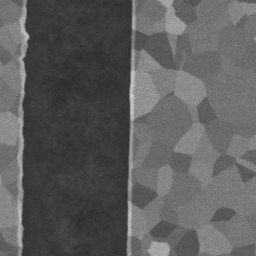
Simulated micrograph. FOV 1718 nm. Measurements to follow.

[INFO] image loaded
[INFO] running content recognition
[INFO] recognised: one or a few lines or trenches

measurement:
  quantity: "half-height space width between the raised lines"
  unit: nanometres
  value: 734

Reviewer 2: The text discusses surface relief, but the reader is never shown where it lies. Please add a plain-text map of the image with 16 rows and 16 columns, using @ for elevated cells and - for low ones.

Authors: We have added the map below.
@@------@@@@@@@@
@-------@@@@@@@@
@@------@@@@@@@@
@-------@@@@@@@@
@-------@@@@@@@@
@-------@@@@@@@@
@-------@@@@@@@@
@-------@@@@@@@@
@-------@@@@@@@@
@-------@@@@@@@@
@-------@@@@@@@@
@-------@@@@@@@@
@-------@@@@@@@@
@-------@@@@@@@@
@-------@@@@@@@@
@-------@@@@@@@@